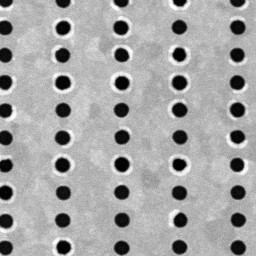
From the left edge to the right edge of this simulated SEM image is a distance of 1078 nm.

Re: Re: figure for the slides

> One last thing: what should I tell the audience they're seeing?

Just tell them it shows a regular array of holes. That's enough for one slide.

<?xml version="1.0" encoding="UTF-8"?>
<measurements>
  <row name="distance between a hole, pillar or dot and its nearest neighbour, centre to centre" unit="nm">115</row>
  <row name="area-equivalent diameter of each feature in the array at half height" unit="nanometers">65.4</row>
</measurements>